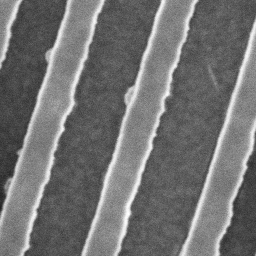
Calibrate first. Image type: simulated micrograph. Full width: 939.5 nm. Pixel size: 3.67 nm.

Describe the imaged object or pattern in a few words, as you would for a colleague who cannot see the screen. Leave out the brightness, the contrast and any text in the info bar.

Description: lines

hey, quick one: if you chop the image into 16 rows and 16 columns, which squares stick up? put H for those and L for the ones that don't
HLLLHHLLLLHHLLLL
HLLLHHLLLLHHLLLL
HLLLHHLLLHHHLLLL
LLLHHLLLLHHLLLLH
LLLHHLLLLHHLLLLH
LLLHHLLLHHHLLLLH
LLHHHLLLHHLLLLHH
LLHHLLLLHHLLLLHH
LLHHLLLHHHLLLLHH
LHHLLLLHHLLLLHHH
LHHLLLLHHLLLLHHL
LHHLLLLHHLLLLHHL
HHHLLLHHLLLLHHHL
HHLLLLHHLLLLHHLL
HHLLLLHHLLLLHHLL
HHLLLHHLLLLHHHLL